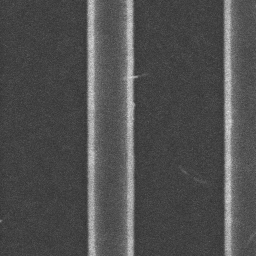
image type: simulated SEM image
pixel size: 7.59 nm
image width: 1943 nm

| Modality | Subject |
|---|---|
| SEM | one or a few lines or trenches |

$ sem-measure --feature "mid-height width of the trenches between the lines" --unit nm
740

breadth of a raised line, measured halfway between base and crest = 39.2 pixels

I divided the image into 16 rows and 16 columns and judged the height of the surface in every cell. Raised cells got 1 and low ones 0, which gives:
0000001100000011
0000001100000011
0000001100000011
0000001100000011
0000001100000011
0000001100000011
0000001100000011
0000001100000011
0000001100000011
0000001100000011
0000001100000011
0000001100000011
0000001100000011
0000001100000011
0000001100000011
0000001100000011